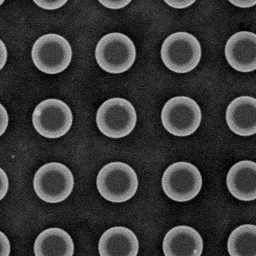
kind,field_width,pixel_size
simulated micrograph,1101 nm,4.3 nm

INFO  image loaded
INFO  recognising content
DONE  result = an array of small figures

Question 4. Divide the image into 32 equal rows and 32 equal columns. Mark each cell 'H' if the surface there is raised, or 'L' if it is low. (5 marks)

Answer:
LLLLLHHHLLLLLHHHLLLLLHHHLLLLLHHH
LLLLLLLLLLLLLLLLLLLLLLLLLLLLLLLL
LLLLLLLLLLLLLLLLLLLLLLLLLLLLLLLL
LLLLLLLLLLLLLLLLLLLLLLLLLLLLLLLL
LLLLLHHHLLLLLHHHLLLLLHHHLLLLLHHH
LLLLHHHHHLLLHHHHHLLLHHHHHLLLHHHH
HLLLHHHHHLLLHHHHHLLLHHHHHLLLHHHH
HLLLHHHHHLLLHHHHHLLLHHHHHLLLHHHH
LLLLLHHHLLLLLHHHLLLLLHHHLLLLLHHH
LLLLLLLLLLLLLLLLLLLLLLLLLLLLLLLL
LLLLLLLLLLLLLLLLLLLLLLLLLLLLLLLL
LLLLLLLLLLLLLLLLLLLLLLLLLLLLLLLL
LLLLLLHLLLLLLLHHLLLLLHHHLLLLLHHH
LLLLHHHHHLLLHHHHHLLLHHHHHLLLHHHH
HLLLHHHHHLLLHHHHHLLLHHHHHLLLHHHH
HLLLHHHHHLLLHHHHHLLLHHHHHLLLLHHH
LLLLLHHHLLLLLHHHLLLLLHHHLLLLLHHH
LLLLLLLLLLLLLLLLLLLLLLLLLLLLLLLL
LLLLLLLLLLLLLLLLLLLLLLLLLLLLLLLL
LLLLLLLLLLLLLLLLLLLLLLLLLLLLLLLL
LLLLLLHHLLLLLLHHLLLLLLHHLLLLLHHH
LLLLLHHHHLLLHHHHHLLLLHHHHLLLLHHH
HLLLHHHHHLLLHHHHHLLLHHHHHLLLHHHH
HLLLHHHHHLLLHHHHHLLLHHHHHLLLLHHH
LLLLLHHHLLLLLHHHHLLLLHHHLLLLLHHH
LLLLLLLLLLLLLLLLLLLLLLLLLLLLLLLL
LLLLLLLLLLLLLLLLLLLLLLLLLLLLLLLL
LLLLLLLLLLLLLLLLLLLLLLLLLLLLLLLL
LLLLLLLLLLLLLLHHLLLLLLHHLLLLLLHH
HLLLLHHHHLLLLHHHHLLLLHHHHLLLLHHH
HLLLHHHHHLLLHHHHHLLLHHHHHLLLHHHH
HLLLHHHHHLLLHHHHHLLLLHHHHLLLLHHH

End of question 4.